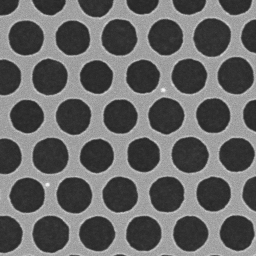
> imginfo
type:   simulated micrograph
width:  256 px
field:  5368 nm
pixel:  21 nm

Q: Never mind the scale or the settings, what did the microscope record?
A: a regular array of holes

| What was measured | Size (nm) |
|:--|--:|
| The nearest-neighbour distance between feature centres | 952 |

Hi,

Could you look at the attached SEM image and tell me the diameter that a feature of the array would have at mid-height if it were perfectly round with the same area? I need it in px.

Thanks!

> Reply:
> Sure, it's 36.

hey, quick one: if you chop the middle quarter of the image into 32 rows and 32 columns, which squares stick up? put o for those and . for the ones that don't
ooooo......ooooo.......ooooo....
.ooo........oooo........ooo.....
.ooo........ooo.........ooo.....
.ooo........ooo.........ooo.....
.ooo........oooo........ooo.....
ooooo.......oooo.......ooooo....
ooooo......oooooo.....ooooooo...
oooooooo.oooooooooo.ooooooooooo.
oooooooooooooooooooooooo..oooooo
.....ooooooo.....oooooo.....oooo
......oooo.......ooooo.......ooo
.......ooo........ooo.........oo
.......ooo........ooo.........oo
.......ooo........ooo.........oo
.......ooo........ooo.........oo
......oooo........oooo.......ooo
.....oooooo......oooooo.....oooo
o...ooooooooo..oooooooooo.oooooo
ooooooooooooooooooo..ooooooooo..
oooooo.....oooooo......ooooo....
.oooo.......oooo........ooo.....
.ooo........oooo........ooo.....
.ooo.........ooo........ooo.....
.ooo.........ooo........ooo.....
.ooo........oooo........ooo.....
.oooo......ooooo.......ooooo....
oooooo.....ooooooo....ooooooo...
oooooooo.ooooooooooooooooooooooo
....oooooooo....oooooooo....oooo
......ooooo......ooooo.......ooo
.......ooo........oooo........oo
.......ooo........ooo.........oo